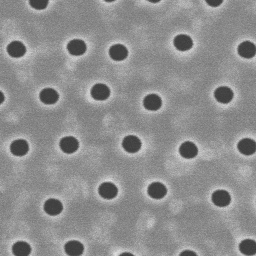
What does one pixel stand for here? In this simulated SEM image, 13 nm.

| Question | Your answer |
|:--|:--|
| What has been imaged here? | a regular array of holes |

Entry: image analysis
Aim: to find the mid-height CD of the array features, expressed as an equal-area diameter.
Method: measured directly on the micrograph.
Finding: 245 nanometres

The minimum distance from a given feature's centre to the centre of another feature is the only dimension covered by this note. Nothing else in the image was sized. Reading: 648 nanometers